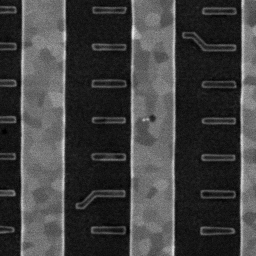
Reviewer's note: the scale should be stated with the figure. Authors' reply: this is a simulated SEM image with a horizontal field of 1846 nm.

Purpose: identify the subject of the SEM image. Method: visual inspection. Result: wiring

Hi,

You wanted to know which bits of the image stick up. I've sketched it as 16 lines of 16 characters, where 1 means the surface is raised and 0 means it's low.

0111000011100001
0111000011100001
0111000011100001
0111000011100001
0111000011100001
0111000011100001
0111000011100001
0111000011100001
0111000011100001
0111000011100001
0111000011100001
0111000011100001
0111000011100001
0111000011100001
0111000011100001
0111000011100001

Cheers